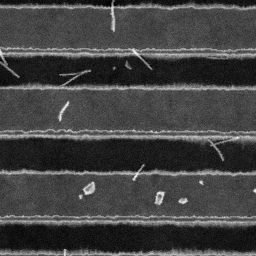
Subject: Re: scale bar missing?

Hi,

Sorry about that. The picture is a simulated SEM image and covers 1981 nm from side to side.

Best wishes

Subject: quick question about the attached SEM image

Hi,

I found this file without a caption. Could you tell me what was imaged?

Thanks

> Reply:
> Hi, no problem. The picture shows lines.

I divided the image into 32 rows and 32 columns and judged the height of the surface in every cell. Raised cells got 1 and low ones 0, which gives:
00000000000000000000000000000000
11111111111111111111111111111111
11111111111111111111111111111111
11111111111111111111111111111111
11111111111111111111111111111111
11111111111111111111111111111111
11111111111111111111111111111111
00000000000000000000000000000000
00000000000000000000000000000000
00000000000000000000000000000000
00000000000000000000000000000000
11111111111111111111111111111111
11111111111111111111111111111111
11111111111111111111111111111111
11111111111111111111111111111111
11111111111111111111111111111111
11111111111111111111111111111111
00000000000000000000000000000000
00000000000000000000000000000000
00000000000000000000000000000000
00000000000000000000000000000000
00000000000000000000000000000000
11111111111111111111111111111111
11111111111111111111111111111111
11111111111111111111111111111111
11111111111111111111111111111111
11111111111111111111111111111111
11111111111111111111111111111111
00000000000000000000000000000000
00000000000000000000000000000000
00000000000000000000000000000000
00000000000000000000000000000000